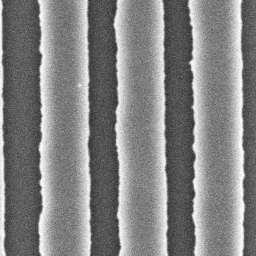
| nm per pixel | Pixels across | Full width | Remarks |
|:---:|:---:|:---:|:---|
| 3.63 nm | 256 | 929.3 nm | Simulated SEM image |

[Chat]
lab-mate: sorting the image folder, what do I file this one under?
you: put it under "lines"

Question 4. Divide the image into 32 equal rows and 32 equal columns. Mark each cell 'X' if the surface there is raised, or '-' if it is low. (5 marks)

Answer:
-----XXXXXX----XXXXX----XXXXXX--
-----XXXXXX----XXXXX----XXXXXX--
-----XXXXXX---XXXXXX----XXXXXX--
-----XXXXXX---XXXXXX----XXXXXX--
-----XXXXXX---XXXXXX----XXXXXX--
-----XXXXXX----XXXXX----XXXXXX--
-----XXXXXX----XXXXX----XXXXXX--
-----XXXXXX----XXXXX----XXXXXX--
-----XXXXXX----XXXXX----XXXXXX--
-----XXXXXX----XXXXXX---XXXXXX--
-----XXXXXX----XXXXX----XXXXXX--
-----XXXXXX----XXXXXX---XXXXXX--
-----XXXXXX----XXXXXX---XXXXXX--
-----XXXXXX----XXXXXX---XXXXXX--
-----XXXXXX----XXXXXX---XXXXXX--
-----XXXXXX---XXXXXXX---XXXXXX--
-----XXXXXX---XXXXXX----XXXXXX--
-----XXXXXX----XXXXXX---XXXXXX--
-----XXXXXX----XXXXXX---XXXXXX--
-----XXXXXX----XXXXXX---XXXXXX--
-----XXXXXX----XXXXXX---XXXXXX--
-----XXXXXX----XXXXXX---XXXXXX--
X----XXXXXX----XXXXXX---XXXXXX--
X----XXXXXX----XXXXXX---XXXXXX--
X----XXXXXX----XXXXXX---XXXXXX--
X----XXXXXX----XXXXXX---XXXXXX--
X----XXXXXX----XXXXXX---XXXXXX--
X----XXXXXX----XXXXXX---XXXXXX--
X----XXXXXX----XXXXXX---XXXXXX--
X----XXXXXX----XXXXXX---XXXXXX--
-----XXXXXX----XXXXXX---XXXXXX--
X----XXXXXX----XXXXXX---XXXXXX--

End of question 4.